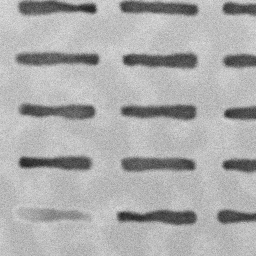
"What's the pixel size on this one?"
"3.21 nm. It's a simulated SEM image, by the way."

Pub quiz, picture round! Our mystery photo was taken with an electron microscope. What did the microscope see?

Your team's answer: a regular array of holes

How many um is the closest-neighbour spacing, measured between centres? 0.167